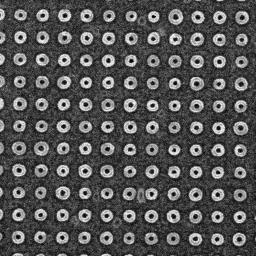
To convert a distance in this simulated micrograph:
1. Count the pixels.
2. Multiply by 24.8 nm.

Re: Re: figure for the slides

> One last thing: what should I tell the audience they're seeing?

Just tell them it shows a regular array of ring-shaped raised bodies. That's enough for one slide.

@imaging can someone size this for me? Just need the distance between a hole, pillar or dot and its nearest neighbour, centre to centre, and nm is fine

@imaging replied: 538